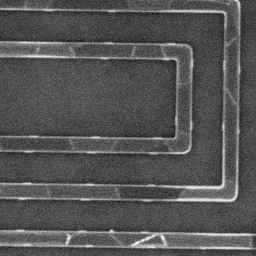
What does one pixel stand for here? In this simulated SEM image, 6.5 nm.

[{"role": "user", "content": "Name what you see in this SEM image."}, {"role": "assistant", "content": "groups of lines, slits or small figures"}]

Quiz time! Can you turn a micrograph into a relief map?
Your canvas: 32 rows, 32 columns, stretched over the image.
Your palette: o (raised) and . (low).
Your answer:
oooooooooooooooooooooooooooooo..
...........................ooo..
............................oo..
............................oo..
............................oo..
ooooooooooooooooo...........oo..
oooooooooooooooooooooooo....oo..
......................oo....oo..
......................oo....oo..
......................oo....oo..
......................oo....oo..
......................oo....oo..
......................oo....oo..
......................oo....oo..
......................oo....oo..
......................oo....oo..
......................oo....oo..
oooooooooooooooooooooooo....oo..
oooooooooooooooooooooooo....oo..
............................oo..
............................oo..
............................oo..
............................oo..
oooooooooooooooooooooooooooooo..
oooooooooooooooooooooooooooooo..
................................
................................
................................
................................
oooooooooooooooooooooooooooooooo
oooooooooooooooooooooooooooooooo
................................